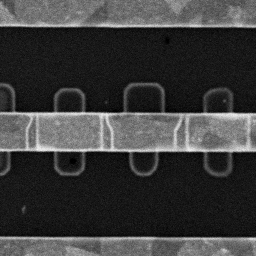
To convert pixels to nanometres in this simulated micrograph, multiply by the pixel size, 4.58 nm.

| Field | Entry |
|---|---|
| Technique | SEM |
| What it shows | wiring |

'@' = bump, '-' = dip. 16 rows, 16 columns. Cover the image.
@@@@@@@@@@@@@@@@
@@@@---@@@@@@@@@
----------------
----------------
----------------
----------------
----------------
@@@@@@@@@@@@@@@@
@@@@@@@@@@@@@@@@
----------------
----------------
----------------
----------------
----------------
----------------
@@@@@@@@@@@@@@@@